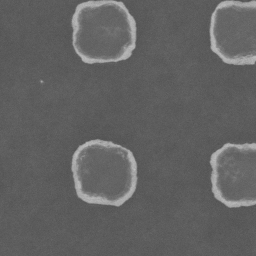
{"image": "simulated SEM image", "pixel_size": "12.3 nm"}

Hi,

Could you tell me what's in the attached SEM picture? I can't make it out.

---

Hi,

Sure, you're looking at raised bodies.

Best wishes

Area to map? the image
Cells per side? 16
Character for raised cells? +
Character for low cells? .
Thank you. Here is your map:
.....+++......++
.....+++.....+++
.....+++.....+++
.....+++......++
................
................
................
................
................
.....+++......++
.....+++.....+++
.....+++.....+++
......++......++
................
................
................